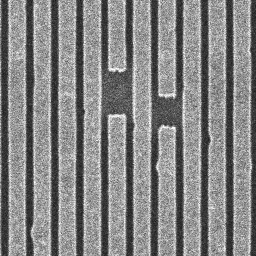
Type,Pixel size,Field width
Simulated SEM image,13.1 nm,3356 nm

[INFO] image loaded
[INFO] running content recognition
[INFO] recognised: parallel lines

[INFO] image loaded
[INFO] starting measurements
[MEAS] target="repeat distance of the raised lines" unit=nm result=328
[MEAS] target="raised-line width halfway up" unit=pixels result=18.1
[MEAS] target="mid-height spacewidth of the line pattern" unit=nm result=91.8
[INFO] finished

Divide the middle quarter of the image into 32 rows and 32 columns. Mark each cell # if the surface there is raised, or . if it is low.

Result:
###..####..####..#####..####..##
###..####..####..#####..####..##
###..####........#####..####..##
###..####.........####..####..##
###..####........#####..####..##
###..####........#####..####..##
###..####........#####..####..##
###..####........#####..####..##
###..####........#####........##
###..####........#####........##
###..####........#####........##
###..####........#####........##
###..####........#####........##
###..####..####..#####........##
###..####..####..#####........##
###..####..####...####........##
###..####..####..#####..####..##
###..####..####..#####..####..##
###..####..####..#####..####..##
###..####..####..#####..####..##
###..####..####..#####..####..##
###..####..####..#####..####..##
###..####..####..#####..####..##
###..####..####..#####..####..##
###..####..####..#####.#####..##
###..####..####..#####.#####..##
###..####..####..#####.#####..##
###..####..####..#####.#####..##
###..####..####..#####..####..##
###..####..####..#####..####..##
###..####..####..#####..####..##
###..####..####..#####..####..##